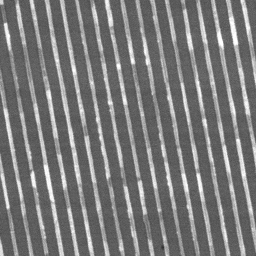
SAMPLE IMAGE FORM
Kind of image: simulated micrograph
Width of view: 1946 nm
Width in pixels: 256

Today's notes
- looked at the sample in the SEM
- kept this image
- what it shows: parallel lines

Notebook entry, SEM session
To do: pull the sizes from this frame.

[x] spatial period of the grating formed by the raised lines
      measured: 113 nanometers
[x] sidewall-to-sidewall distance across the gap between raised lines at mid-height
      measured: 90.6 nanometres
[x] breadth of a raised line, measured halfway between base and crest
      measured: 21.5 nanometers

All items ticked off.